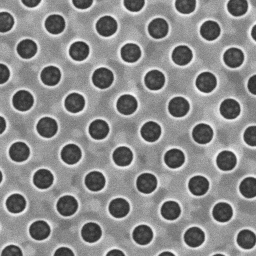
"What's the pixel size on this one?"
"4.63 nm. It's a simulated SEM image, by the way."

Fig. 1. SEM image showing a regular array of holes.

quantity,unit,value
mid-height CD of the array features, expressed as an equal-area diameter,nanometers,101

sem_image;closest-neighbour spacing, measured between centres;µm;0.166